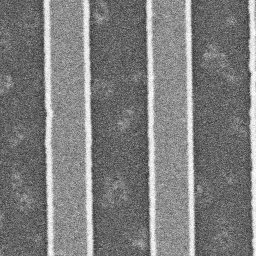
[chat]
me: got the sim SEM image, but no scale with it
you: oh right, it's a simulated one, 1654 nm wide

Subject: one or a few lines or trenches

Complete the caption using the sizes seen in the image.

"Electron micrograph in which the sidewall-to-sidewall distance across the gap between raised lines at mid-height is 63.2 pixels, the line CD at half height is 0.252 micrometres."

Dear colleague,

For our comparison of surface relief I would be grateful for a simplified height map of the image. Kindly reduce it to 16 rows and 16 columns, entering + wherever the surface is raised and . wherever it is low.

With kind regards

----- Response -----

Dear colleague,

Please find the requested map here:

...++....+++....
...++....+++....
...++....+++....
...++....+++....
...++....+++....
...++....+++....
...++....+++....
...+++...+++....
...+++...+++....
...++....+++....
...+++....++....
...+++....++....
...+++....++....
...+++....++....
...+++....++....
...+++....++....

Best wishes